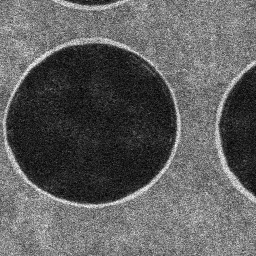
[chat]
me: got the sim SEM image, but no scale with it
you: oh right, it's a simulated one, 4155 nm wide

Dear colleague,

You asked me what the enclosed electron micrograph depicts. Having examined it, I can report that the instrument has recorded raised bodies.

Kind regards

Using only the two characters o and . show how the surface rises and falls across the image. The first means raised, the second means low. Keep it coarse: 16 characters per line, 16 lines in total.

................
................
................
...oooooo.......
..oooooooo.....o
.oooooooooo...oo
ooooooooooo...oo
ooooooooooo...oo
ooooooooooo...oo
.oooooooooo...oo
.ooooooooo....oo
..ooooooo......o
....oooo........
................
................
................